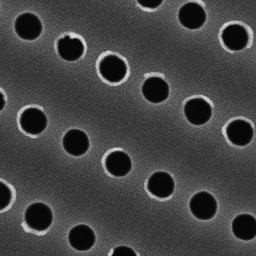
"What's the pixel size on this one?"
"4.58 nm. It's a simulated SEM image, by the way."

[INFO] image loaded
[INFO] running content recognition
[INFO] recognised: a regular array of holes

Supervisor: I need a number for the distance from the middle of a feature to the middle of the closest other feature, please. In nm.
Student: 217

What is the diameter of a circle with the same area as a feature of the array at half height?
116 nanometres